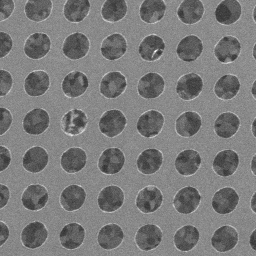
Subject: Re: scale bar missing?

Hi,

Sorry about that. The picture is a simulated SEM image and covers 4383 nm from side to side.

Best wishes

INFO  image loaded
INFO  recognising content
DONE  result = a regular array of raised bodies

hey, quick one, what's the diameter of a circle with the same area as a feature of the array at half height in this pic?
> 0.465 um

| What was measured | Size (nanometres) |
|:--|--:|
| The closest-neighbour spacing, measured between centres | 645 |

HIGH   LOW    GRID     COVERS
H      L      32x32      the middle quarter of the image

LLLLLLLLLLLLLLLLLLLLLLLLLLLLLLLL
LLLLLLLLLLLLLLLLLLLLLLLLLLLLLLLL
LHHHHLLLLLLHHHLLLLLLLHHHLLLLLLLH
HHHHHHLLLLHHHHHLLLLHHHHHHLLLLHHH
HHHHHHLLLHHHHHHHLLLHHHHHHLLLHHHH
HHHHHHLLLHHHHHHHLLHHHHHHHLLLHHHH
HHHHHHLLLHHHHHHLLLHHHHHHHLLLHHHH
HHHHHLLLLHHHHHLLLLLHHHHHLLLLHHHH
LLLLLLLLLLLHLLLLLLLLHHHLLLLLLHHH
LLLLLLLLLLLLLLLLLLLLLLLLLLLLLLLL
LLLLLLLLLLLLLLLLLLLLLLLLLLLLLLLL
LLLLLLLLLLLHHLLLLLLLLLLLLLLLLLLL
LLLLLLLLLLHHHHHLLLLLHHHHLLLLLHHH
LLLLLLLLLHHHHHHLLLLHHHHHHLLLHHHH
LLLLLLLLLHHHHHHHLLHHHHHHHLLLHHHH
LLLLLLLLLHHHHHHLLLHHHHHHHLLLHHHH
LLLLLLLLLHHHHHHLLLHHHHHHLLLLHHHH
LLLLLLLLLLHHHHLLLLLHHHHLLLLLLHHH
LLLLLLLLLLLLLLLLLLLLLLLLLLLLLLLL
LLLLLLLLLLLLLLLLLLLLLLLLLLLLLLLL
LLLLLLLLLLLLLLLLLLLLLLLLLLLLLLLL
LHHHHLLLLLHHHHLLLLLLHHHHLLLLLLHH
HHHHHHLLLHHHHHHLLLLHHHHHHLLLLHHH
HHHHHHLLLHHHHHHLLLHHHHHHHLLLHHHH
HHHHHHLLHHHHHHHLLLHHHHHHHLLLHHHH
HHHHHLLLHHHHHHHLLLHHHHHHLLLLHHHH
HHHHLLLLLHHHHHLLLLLHHHHHLLLLHHHH
LLLLLLLLLLHHLLLLLLLLHHLLLLLLLHHH
LLLLLLLLLLLLLLLLLLLLLLLLLLLLLLLL
LLLLLLLLLLLLLLLLLLLLLLLLLLLLLLLL
LHHHLLLLLLLHHLLLLLLLLLLLLLLLLLLL
HHHHHLLLLHHHHHHLLLLHHHHHLLLLLHHH